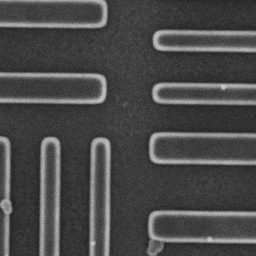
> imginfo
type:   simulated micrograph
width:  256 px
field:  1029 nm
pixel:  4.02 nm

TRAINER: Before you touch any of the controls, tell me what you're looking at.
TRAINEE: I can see groups of lines, slits or small figures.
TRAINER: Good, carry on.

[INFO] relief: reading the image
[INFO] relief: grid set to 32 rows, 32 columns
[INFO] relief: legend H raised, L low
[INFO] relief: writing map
HHHHHHHHHHHHHLLLLLLLLLLLLLLLLLLL
HHHHHHHHHHHHHLLLLLLLLLLLLLLLLLLL
HHHHHHHHHHHHHLLLLLLLLLLLLLLLLLLL
LLLLLLLLLLLLLLLLLLLLLLLLLLLLLLLL
LLLLLLLLLLLLLLLLLLLLHHHHHHHHHHHH
LLLLLLLLLLLLLLLLLLLHHHHHHHHHHHHH
LLLLLLLLLLLLLLLLLLLLLLLLLLLLLLLL
LLLLLLLLLLLLLLLLLLLLLLLLLLLLLLLL
LLLLLLLLLLLLLLLLLLLLLLLLLLLLLLLL
HHHHHHHHHHHHLLLLLLLLLLLLLLLLLLLL
HHHHHHHHHHHHHLLLLLLLLLLLLLLLLLLL
HHHHHHHHHHHHHLLLLLLHHHHHHHHHHHHH
HHHHHHHHHHHHHLLLLLLLHHHHHHHHHHHH
LLLLLLLLLLLLLLLLLLLLLLLLLLLLLLLL
LLLLLLLLLLLLLLLLLLLLLLLLLLLLLLLL
LLLLLLLLLLLLLLLLLLLLLLLLLLLLLLLL
LLLLLLLLLLLLLLLLLLLLLLLLLLLLLLLL
HLLLLLHLLLLLHLLLLLLHHHHHHHHHHHHH
HLLLLHHLLLLLHHLLLLLHHHHHHHHHHHHH
HLLLLHHLLLLLHHLLLLLHHHHHHHHHHHHH
HLLLLHHLLLLLHHLLLLLLLLLLLLLLLLLL
HLLLLHHLLLLLHHLLLLLLLLLLLLLLLLLL
HLLLLHHLLLLLHHLLLLLLLLLLLLLLLLLL
HLLLLHHLLLLLHHLLLLLLLLLLLLLLLLLL
HLLLLHHLLLLLHHLLLLLLLLLLLLLLLLLL
HLLLLHHLLLLLHHLLLLLLLLLLLLLLLLLL
HLLLLHHLLLLLHLLLLLLLLLLLLLLLLLLL
HLLLLHHLLLLLHLLLLLLHHHHHHHHHHHHH
HLLLLHHLLLLLHLLLLLLHHHHHHHHHHHHH
HLLLLHHLLLLLHLLLLLLHHHHHHHHHHHHH
HLLLLHHLLLLHHLLLLLLLLLLLLLLLLLLL
HLLLLHHLLLLHHLLLLLLLLLLLLLLLLLLL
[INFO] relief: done